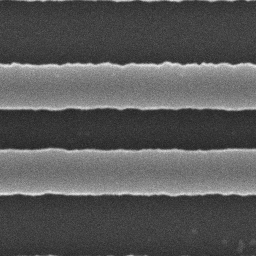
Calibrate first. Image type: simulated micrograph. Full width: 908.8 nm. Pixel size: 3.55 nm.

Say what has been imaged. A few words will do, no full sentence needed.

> lines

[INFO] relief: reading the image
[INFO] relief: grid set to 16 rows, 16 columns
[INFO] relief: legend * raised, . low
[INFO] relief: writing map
................
................
................
................
****************
****************
****************
................
................
****************
****************
****************
................
................
................
................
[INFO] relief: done